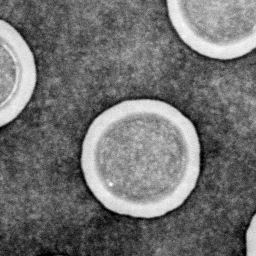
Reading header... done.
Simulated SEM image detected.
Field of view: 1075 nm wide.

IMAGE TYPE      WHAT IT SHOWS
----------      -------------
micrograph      raised bodies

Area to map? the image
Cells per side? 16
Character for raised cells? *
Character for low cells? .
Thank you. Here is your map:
...........*****
...........*****
*...........****
**..............
**..............
**..............
*...............
.......****.....
......******....
......******....
......******....
......******....
.......****.....
................
................
................